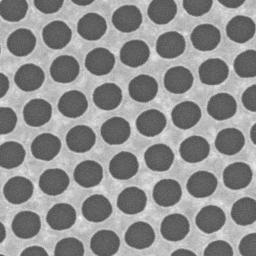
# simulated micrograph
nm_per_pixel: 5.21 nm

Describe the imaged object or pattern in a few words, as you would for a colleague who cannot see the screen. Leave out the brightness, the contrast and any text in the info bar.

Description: a regular array of holes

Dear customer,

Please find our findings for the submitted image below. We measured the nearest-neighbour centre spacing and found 0.185 µm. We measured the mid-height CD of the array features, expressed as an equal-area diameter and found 0.155 microns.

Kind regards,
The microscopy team